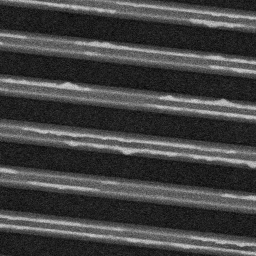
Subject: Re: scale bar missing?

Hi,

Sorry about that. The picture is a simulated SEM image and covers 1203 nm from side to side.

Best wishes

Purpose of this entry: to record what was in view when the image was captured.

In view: parallel lines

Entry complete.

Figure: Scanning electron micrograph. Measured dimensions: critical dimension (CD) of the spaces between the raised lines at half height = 137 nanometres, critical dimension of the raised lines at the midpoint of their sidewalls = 76.6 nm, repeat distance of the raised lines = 212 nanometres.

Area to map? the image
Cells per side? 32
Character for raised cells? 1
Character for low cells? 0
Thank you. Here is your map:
00111111111111111111000000000000
00000000000111111111111111111000
00000000000000000000111111111111
00000000000000000000000000000111
11111000000000000000000000000000
11111111111111000000000000000000
00000011111111111111111000000000
00000000000000011111111111111111
00000000000000000000000011111111
00000000000000000000000000000000
11111111100000000000000000000000
11111111111111111100000000000000
00000000111111111111111111010000
00000000000000000111111111111111
00000000000000000000000000111111
11000000000000000000000000000000
11111111111000000000000000000000
00111111111111111111000000000000
00000000000111111111111111111000
00000000000000000000111111111111
00000000000000000000000000000111
11111000000000000000000000000000
11111111111111000000000000000000
00000011111111111111111000000000
00000000000000011111111111111111
00000000000000000000000011111111
00000000000000000000000000000000
11111111000000000000000000000000
11111111111111111000000000000000
00000000111111111111111111000000
00000000000000000111111111111111
00000000000000000000000000111111